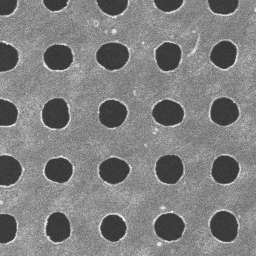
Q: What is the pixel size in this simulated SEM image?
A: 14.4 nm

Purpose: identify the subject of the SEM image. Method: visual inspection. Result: a regular array of holes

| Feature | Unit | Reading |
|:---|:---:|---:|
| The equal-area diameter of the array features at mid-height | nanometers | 411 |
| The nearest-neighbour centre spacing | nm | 799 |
